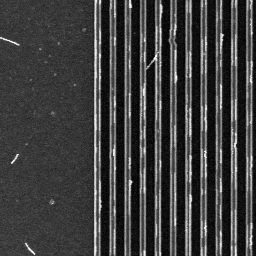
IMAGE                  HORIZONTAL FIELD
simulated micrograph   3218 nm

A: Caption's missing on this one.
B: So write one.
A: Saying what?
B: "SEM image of parallel lines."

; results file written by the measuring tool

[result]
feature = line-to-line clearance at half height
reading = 9.63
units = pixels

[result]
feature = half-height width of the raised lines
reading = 5.25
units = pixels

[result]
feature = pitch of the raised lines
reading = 15.1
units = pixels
